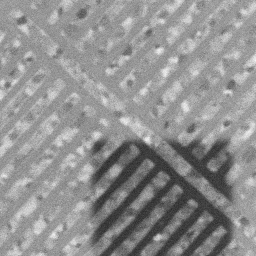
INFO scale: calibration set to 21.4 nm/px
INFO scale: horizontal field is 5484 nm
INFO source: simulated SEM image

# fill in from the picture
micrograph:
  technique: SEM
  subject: groups of lines, slits or small figures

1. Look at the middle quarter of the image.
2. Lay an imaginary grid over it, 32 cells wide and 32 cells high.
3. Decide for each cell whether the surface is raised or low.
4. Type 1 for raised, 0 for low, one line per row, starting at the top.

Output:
11110000000011100011110001111000
01111100000111000111100011110001
00111110001110001111000111100011
00011111000000001110001111000111
00001111100000011100011110001111
00000111110000111000111100011110
00000011111000110001111000111100
00100001111100000011110001111000
01110000111110000011100011110001
11100000011111000011000011100011
11000000001111100000000111000111
11000110000111110000001110001111
10001110000011111000001100011110
00011100000001111100000000111100
00111000011000011110000001111000
01110000111000001111000001110001
11110001111000000111100000100011
11100011110001000011111000000111
11000111100011100001111100000111
10001111000111100000111110000110
00011110001111000100011111000000
00111100011110001110000111100000
00111000111100011100000011110000
01110001111000111100000001111000
11110011110001110000110000111110
11100111100011100001110000011111
11001111000111000011110000001111
10001110001111000111100010000111
00011100011110001111000111000011
00111000111100011110001111000001
01111000111000111100011110000000
11110001111001111000111100011000